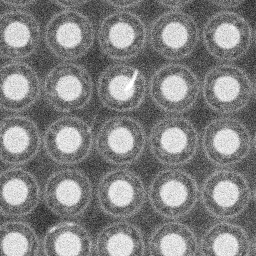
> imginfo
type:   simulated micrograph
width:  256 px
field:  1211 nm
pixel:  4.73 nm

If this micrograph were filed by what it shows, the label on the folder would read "an array of small figures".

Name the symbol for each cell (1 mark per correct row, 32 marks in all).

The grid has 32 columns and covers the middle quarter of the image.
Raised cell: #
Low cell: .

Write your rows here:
..#########################.####
.....######....#.#######.......#
......####.........####.........
###...###....###...###....###...
####..###...#####...##...#####..
####...##..######...##..#######.
####...##..######...##..#######.
####..###...#####...##...#####..
###...###....###...####...####..
.....#####.........####.........
....#######.......######.......#
#.#########################..###
################################
################################
....#######......########.....##
......####.........####........#
###...####...###...####...###...
####..###...#####..###...#####..
####...##..######...##..#######.
####...#...######...##..#######.
####..###..######...##...#####..
###...###...####...###...#####..
......####....#....####.........
....#######.......######.......#
#.###########..###########...###
################################
################################
....########.....#######......##
.....#####........#####........#
##....####...###...####...###...
####..###...#####..###...#####..
####...##..######..###..######..